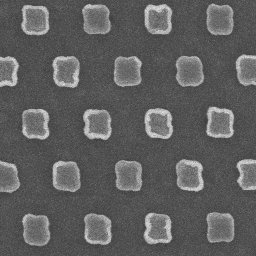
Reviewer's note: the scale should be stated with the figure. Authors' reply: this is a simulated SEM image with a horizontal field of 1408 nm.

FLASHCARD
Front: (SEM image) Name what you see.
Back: a regular array of raised bodies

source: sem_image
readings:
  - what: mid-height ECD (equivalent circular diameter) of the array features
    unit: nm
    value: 166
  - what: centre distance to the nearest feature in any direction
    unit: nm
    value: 330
